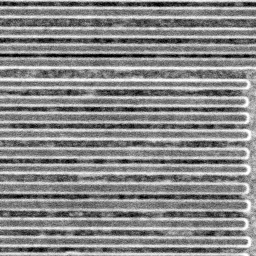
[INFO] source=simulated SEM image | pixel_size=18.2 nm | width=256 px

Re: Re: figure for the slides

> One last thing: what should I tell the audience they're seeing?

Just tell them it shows parallel lines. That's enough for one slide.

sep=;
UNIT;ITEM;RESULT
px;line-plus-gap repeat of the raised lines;17.6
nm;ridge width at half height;171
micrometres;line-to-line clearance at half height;0.139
